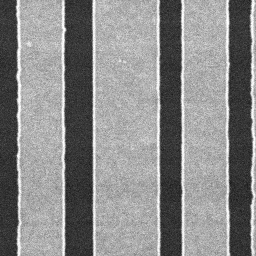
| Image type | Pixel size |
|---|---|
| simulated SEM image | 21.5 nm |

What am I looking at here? one or a few lines or trenches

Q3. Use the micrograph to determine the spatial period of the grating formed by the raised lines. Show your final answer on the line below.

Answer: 1760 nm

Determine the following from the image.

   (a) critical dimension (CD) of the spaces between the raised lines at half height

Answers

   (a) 25 px